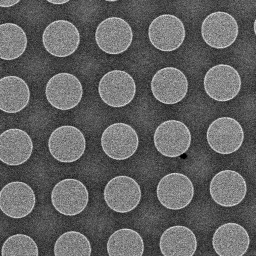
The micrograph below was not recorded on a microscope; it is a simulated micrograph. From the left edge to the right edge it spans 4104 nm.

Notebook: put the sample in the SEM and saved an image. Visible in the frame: an array of small figures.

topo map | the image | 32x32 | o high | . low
oo..............................
................................
.............oo....ooo....ooo...
oo....ooo...oooo...oooo..ooooo..
ooo..ooooo..oooo...oooo..ooooo..
ooo..ooooo..oooo...oooo...ooo...
ooo...ooo....oo.................
................................
...........................oo...
.......oo....ooo...oooo...oooo..
ooo...oooo..ooooo..oooo...oooo..
oooo..oooo..ooooo..oooo...oooo..
oooo..oooo...ooo....oo.....o....
ooo....oo.......................
................................
..............o.....ooo....ooo..
.oo....ooo...oooo..ooooo..oooo..
oooo..ooooo..oooo..ooooo..oooo..
oooo..ooooo..oooo...ooo....ooo..
oooo...ooo....oo.....o..........
.o..............................
............................o...
........o.....ooo...oooo...ooo..
oooo...oooo..oooo...oooo..ooooo.
oooo...oooo..oooo...oooo..ooooo.
oooo...oooo..oooo...ooo....ooo..
.ooo....oo......................
................................
.....................oo....ooo..
..o.....oo....ooo...oooo...oooo.
.ooo...oooo..ooooo..ooooo..oooo.
ooooo..oooo...oooo..oooo...oooo.